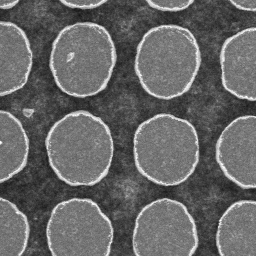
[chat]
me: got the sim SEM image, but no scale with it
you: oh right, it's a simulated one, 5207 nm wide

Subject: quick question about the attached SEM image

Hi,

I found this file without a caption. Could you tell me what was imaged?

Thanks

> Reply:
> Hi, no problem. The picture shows raised bodies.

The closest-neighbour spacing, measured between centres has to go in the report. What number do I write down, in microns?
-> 1.74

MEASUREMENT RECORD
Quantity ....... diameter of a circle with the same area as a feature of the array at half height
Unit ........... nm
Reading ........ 1390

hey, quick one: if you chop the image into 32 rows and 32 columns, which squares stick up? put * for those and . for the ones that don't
**......****.......*****.....***
................................
................................
**......*****.......***.........
***....*******....******.....***
***....*******....*******...****
****...*******...********...****
****..********...********...****
****..********...********...****
***....*******...*******....****
***....******.....******....****
*.......****.......****......***
................................
................................
**......****........*...........
**.....******.....******.....***
***...********...*******....****
***...********...********..*****
***...********...********..*****
***...********...********..*****
***...********...*******...*****
**.....******.....******....****
*.......****.......****......***
................................
................................
*......*****.......****......***
**.....******.....*****.....****
***...********...*******....****
****..********...*******...*****
***...********...*******...*****
***...********...********..*****
***....*******...*******...*****